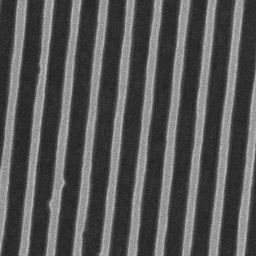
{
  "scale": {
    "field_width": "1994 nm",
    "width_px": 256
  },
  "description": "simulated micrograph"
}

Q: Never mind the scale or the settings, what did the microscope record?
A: parallel lines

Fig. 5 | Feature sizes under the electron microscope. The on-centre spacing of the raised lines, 210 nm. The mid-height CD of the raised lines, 87.2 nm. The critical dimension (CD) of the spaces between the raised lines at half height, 124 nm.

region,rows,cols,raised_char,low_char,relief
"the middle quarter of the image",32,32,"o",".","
ooo....ooo....oo.....oo....ooo..
ooo....oo.....oo....ooo....ooo..
ooo....oo.....oo....ooo....ooo..
oo.....oo....ooo....ooo....ooo..
oo....ooo.....oo....ooo....oo...
oo....ooo....ooo....ooo....oo...
oo.....oo....ooo....ooo....oo...
oo....ooo....ooo....ooo....oo...
oo....ooo....ooo....ooo....oo...
oo....ooo....oo.....oo....ooo...
oo....ooo....oo.....oo....ooo...
oo....oo.....oo....ooo....ooo...
oo....oo.....oo....ooo....ooo...
oo....oo.....oo....ooo....oo....
o.....oo....ooo....ooo....oo....
o....ooo....ooo....ooo....oo....
o....ooo....ooo....oo....ooo....
o....ooo....ooo....oo....ooo....
o....ooo....ooo....oo....ooo....
o....ooo....oo.....oo....ooo....
o....oo.....oo.....oo....ooo....
o....oo.....oo.....oo....ooo....
o....oo.....oo....ooo....ooo....
o....oo.....oo....ooo....ooo....
....ooo....ooo....ooo....ooo....
....ooo....ooo....ooo....oo.....
....ooo....ooo....ooo....oo.....
....ooo....ooo....oo.....oo....o
....ooo....oo.....oo....ooo....o
....ooo....oo.....oo....ooo....o
....ooo....oo....ooo....ooo....o
....ooo....oo....ooo....ooo....o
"